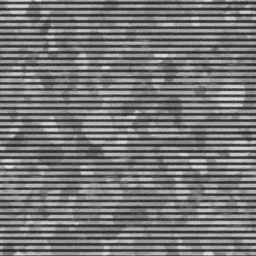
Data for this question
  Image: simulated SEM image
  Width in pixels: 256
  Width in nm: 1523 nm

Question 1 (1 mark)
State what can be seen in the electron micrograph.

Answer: parallel lines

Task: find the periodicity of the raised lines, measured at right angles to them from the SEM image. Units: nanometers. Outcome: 36.8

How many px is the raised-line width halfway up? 2.25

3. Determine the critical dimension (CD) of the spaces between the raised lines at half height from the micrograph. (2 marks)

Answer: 0.0231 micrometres